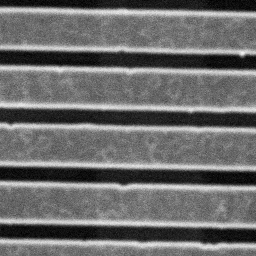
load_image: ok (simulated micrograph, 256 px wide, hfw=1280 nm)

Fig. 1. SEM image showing parallel lines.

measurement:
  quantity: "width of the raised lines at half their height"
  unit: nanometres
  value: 195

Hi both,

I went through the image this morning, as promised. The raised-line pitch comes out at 289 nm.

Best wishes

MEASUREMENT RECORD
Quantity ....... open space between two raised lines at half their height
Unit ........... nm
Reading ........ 93.7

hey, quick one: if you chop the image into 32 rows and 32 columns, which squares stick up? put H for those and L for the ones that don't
LLLLLLLLLLLLLLLLLLLLLLLLLLLLLLLL
HHHHHHHHHHHHHHHHLLHHLLLLLLLLLLLL
HHHHHHHHHHHHHHHHHHHHHHHHHHHHHHHH
HHHHHHHHHHHHHHHHHHHHHHHHHHHHHHHH
HHHHHHHHHHHHHHHHHHHHHHHHHHHHHHHH
HHHHHHHHHHHHHHHHHHHHHHHHHHHHHHHH
LLLLLLLLLLLLLLLLLLLLLLLLLLHHHHHH
LLLLLLLLLLLLLLLLLLLLLLLLLLLLLLLL
HHHLLLHHLLLLLLLLLLLLLLLLLLLLLLLL
HHHHHHHHHHHHHHHHHHHHHHHHHHHHHHHH
HHHHHHHHHHHHHHHHHHHHHHHHHHHHHHHH
HHHHHHHHHHHHHHHHHHHHHHHHHHHHHHHH
HHHHHHHHHHHHHHHHHHHHHHHHHHHHHHHH
LLLLLLLLLLLLLLHHHHHHHHHHHHHHHHHH
LLLLLLLLLLLLLLLLLLLLLLLLLLLLLLLL
LLLLLLLLLLLLLLLLLLLLLLLLLLLLLLLL
HHHHHHHHHHHHHHHHHHHHHHHHHHHHHHHH
HHHHHHHHHHHHHHHHHHHHHHHHHHHHHHHH
HHHHHHHHHHHHHHHHHHHHHHHHHHHHHHHH
HHHHHHHHHHHHHHHHHHHHHHHHHHHHHHHH
LHHHHHHHHHHHHHHHHHHHHHHHHHHHHHHH
LLLLLLLLLLLLLLLLLLLLLLLLLLLLLLLL
LLLLLLLLLLLLLLLLLLLLLLLLLLLLLLLL
HHHHHHHHHHHHHHHHHHHHHHHHHHHHHHHL
HHHHHHHHHHHHHHHHHHHHHHHHHHHHHHHH
HHHHHHHHHHHHHHHHHHHHHHHHHHHHHHHH
HHHHHHHHHHHHHHHHHHHHHHHHHHHHHHHH
HHHHHHHHHHHHHHHHHHHHHHHHHHHHHHHH
LLLLLLLLLLLLLLLLLLLLLLLLLLLLLLLL
LLLLLLLLLLLLLLLLLLLLLLLLLLLLLLLL
HHHHHHHHHHHHHHHHHHLLHHHHLLLLLLLL
HHHHHHHHHHHHHHHHHHHHHHHHHHHHHHHH